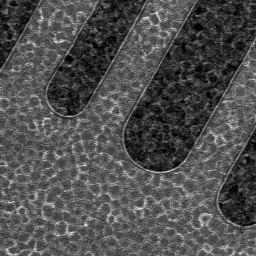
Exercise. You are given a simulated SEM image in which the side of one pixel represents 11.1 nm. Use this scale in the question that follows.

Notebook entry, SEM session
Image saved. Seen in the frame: one or a few lines or trenches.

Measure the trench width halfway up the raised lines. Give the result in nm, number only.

492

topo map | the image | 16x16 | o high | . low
oo....ooo...oooo
oo...ooo...ooooo
o....ooo...ooooo
o...ooo...ooooo.
...oooo...ooooo.
...ooo...ooooo..
...oo....ooooo..
........ooooo...
........oooo....
........oooo...o
.........oo...oo
..............oo
..............oo
..............oo
................
................